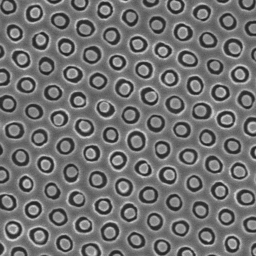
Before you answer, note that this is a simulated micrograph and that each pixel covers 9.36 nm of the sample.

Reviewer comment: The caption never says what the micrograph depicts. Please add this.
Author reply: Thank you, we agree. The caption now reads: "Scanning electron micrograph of a regular array of ring-shaped grooves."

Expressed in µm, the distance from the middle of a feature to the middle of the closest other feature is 0.238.